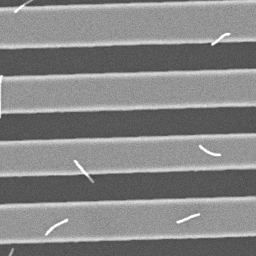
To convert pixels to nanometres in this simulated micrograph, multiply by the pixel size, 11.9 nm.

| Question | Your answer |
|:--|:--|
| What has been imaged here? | lines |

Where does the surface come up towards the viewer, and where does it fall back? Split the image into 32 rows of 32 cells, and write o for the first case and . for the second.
.............ooooooooooooooooooo
oooooooooooooooooooooooooooooooo
oooooooooooooooooooooooooooooooo
oooooooooooooooooooooooooooooooo
oooooooooooooooooooooooooooooooo
ooooooooooooooooo...............
................................
................................
................................
o..ooooooooooooooooooooooooooooo
oooooooooooooooooooooooooooooooo
oooooooooooooooooooooooooooooooo
oooooooooooooooooooooooooooooooo
ooooooooooooooooooooooo.........
................................
................................
................................
.......ooooooooooooooooooooooooo
oooooooooooooooooooooooooooooooo
oooooooooooooooooooooooooooooooo
oooooooooooooooooooooooooooooooo
ooooooooooooooooo...............
................................
................................
................................
..oooooooooooooooooooooooooooooo
oooooooooooooooooooooooooooooooo
oooooooooooooooooooooooooooooooo
oooooooooooooooooooooooooooooooo
ooooooooooooooooooooooooooooooo.
................................
................................